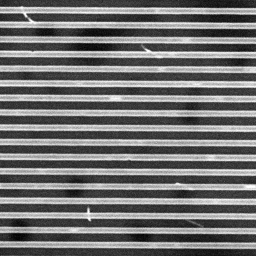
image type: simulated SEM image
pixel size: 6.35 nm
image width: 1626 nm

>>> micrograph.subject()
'parallel lines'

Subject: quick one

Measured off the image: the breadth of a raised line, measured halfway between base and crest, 32.6 nanometers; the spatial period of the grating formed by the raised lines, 14.7 px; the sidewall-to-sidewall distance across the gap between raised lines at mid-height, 0.0595 µm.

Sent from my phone